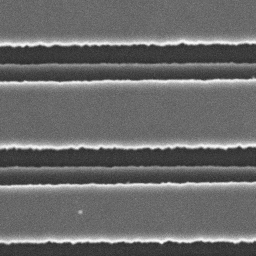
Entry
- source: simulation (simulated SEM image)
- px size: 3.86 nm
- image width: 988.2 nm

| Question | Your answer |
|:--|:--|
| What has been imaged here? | lines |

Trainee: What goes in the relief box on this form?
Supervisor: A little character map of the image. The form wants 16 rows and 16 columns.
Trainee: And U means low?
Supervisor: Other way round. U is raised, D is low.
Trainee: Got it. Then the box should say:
UUUUUUUUUUUUUUUU
UUUUUUUUUUUUUUUU
UUUUUUUUUUUUUUUU
DDDDDDDDDDDDDDDD
DDDDDDDDDDDDDDDD
UUUUUUUUUUUUUUUU
UUUUUUUUUUUUUUUU
UUUUUUUUUUUUUUUU
UUUUUUUUUUUUUUUU
DDDDDDDDDDDDDDDD
DDDDDDDDDDDDDDDD
DDDDDUDUUUUUUUUU
UUUUUUUUUUUUUUUU
UUUUUUUUUUUUUUUU
UUUUUUUUUUUUUUUU
DDDDDDDDDDDDDDDD